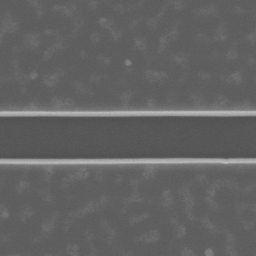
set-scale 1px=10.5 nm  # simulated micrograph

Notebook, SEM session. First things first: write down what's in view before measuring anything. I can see one or a few lines or trenches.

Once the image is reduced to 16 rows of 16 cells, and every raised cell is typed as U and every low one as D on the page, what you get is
UUUUUUUUUUUUUUUU
UUUUUUUUUUUUUUUU
UUUUUUUUUUUUUUUU
UUUUUUUUUUUUUUUU
UUUUUUUUUUUUUUUU
UUUUUUUUUUUUUUUU
UUUUUUUUUUUUUUUU
DDDDDDDDDDDDDDDD
DDDDDDDDDDDDDDDD
DDDDDDDDDDDDDDDD
UUUUUUUUUUUUUUUU
UUUUUUUUUUUUUUUU
UUUUUUUUUUUUUUUU
UUUUUUUUUUUUUUUU
UUUUUUUUUUUUUUUU
UUUUUUUUUUUUUUUU